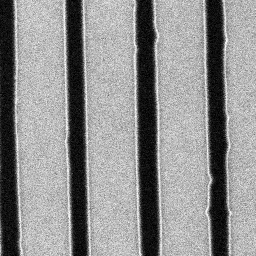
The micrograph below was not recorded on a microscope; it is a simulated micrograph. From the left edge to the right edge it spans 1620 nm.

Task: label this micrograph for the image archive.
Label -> one or a few lines or trenches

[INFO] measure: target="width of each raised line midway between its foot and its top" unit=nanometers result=137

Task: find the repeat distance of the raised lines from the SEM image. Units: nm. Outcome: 444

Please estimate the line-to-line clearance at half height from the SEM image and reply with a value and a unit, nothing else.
306 nm